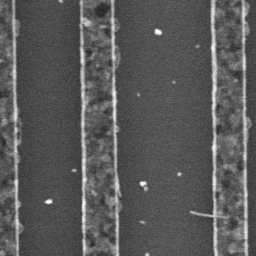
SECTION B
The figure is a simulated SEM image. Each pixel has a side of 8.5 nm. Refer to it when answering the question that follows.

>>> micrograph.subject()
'lines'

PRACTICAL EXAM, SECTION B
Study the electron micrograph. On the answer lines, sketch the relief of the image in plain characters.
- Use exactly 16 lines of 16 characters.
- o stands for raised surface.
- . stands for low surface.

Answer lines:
o....oo......oo.
o....oo......oo.
o....oo......oo.
o....oo......oo.
o....oo......oo.
o....oo......oo.
o....oo......oo.
o....oo......oo.
o....oo......oo.
o....oo......oo.
o....oo......oo.
o....oo......oo.
o....oo......oo.
o....oo......oo.
o....oo......oo.
o....oo......oo.